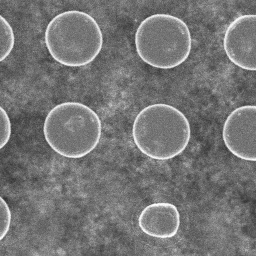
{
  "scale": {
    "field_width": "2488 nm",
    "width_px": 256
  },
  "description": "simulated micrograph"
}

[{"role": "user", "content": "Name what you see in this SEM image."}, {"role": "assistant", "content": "raised bodies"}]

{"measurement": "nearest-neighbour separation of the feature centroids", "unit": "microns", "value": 0.866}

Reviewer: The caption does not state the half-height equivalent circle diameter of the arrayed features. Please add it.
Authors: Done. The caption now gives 536 nanometers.